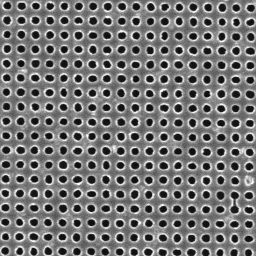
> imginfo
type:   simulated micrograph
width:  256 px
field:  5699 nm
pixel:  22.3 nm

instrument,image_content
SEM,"a regular array of holes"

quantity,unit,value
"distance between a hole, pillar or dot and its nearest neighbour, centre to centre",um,0.314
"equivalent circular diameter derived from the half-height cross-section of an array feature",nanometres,174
